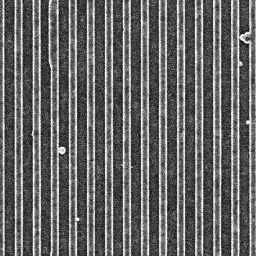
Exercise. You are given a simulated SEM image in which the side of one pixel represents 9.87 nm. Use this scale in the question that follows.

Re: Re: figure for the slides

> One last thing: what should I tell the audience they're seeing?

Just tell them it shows parallel lines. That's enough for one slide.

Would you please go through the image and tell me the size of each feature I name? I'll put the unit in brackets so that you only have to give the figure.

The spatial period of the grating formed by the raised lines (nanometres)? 178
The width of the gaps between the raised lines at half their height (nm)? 111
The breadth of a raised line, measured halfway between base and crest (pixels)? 7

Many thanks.